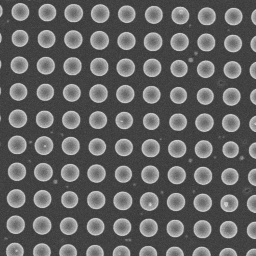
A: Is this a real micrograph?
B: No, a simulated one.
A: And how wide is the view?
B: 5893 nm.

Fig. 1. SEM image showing an array of small figures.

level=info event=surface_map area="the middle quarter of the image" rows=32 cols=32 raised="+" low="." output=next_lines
++++...++++..+++++..++++...++++.
++++...++++..+++++..++++...++++.
.++....+++....+++...++++...+++..
................................
................................
.++.....++.....+................
++++...++++..++++...++++...+++..
++++..+++++..+++++..++++...++++.
++++...++++..++++...++++...++++.
........++....++.....++....+++..
................................
................................
+++....+++....++.....++.........
++++..+++++..++++...++++...+++..
++++..+++++..++++...++++..+++++.
+++....+++....+++...+++....+++..
............................+...
................................
.++.............................
++++...+++...++++...+++....+++..
++++..++++...++++...++++..++++..
++++..++++...++++...++++..++++..
.++....++.....++....+++....+++..
................................
................................
+++....++............+..........
++++..++++...++++...+++...++++..
++++..++++...++++..+++++..++++..
+++...++++...++++...++++..++++..
.......++...........+++....+++..
................................
................................